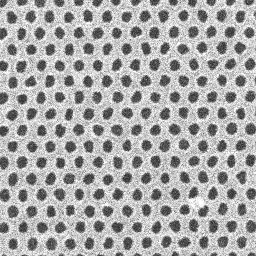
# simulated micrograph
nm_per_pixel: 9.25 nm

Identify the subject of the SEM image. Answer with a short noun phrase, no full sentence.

a regular array of holes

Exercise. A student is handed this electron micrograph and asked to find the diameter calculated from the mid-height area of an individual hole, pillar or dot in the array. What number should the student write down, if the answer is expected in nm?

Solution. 110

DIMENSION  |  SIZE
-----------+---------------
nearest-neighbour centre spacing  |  0.167 µm